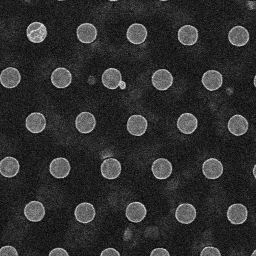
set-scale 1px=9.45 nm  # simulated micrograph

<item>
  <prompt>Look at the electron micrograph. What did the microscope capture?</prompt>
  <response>a regular array of raised bodies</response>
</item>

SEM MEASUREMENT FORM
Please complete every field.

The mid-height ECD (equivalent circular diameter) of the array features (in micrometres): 0.19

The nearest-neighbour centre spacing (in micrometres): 0.474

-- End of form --